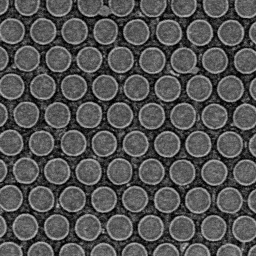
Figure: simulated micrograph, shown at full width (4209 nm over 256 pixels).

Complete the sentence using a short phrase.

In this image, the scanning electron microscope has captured a regular array of raised bodies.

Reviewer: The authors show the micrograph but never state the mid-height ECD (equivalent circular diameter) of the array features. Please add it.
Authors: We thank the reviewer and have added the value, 406 nm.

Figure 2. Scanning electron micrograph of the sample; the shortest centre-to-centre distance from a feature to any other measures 512 nm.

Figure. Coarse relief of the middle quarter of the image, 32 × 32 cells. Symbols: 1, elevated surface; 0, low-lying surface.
10001111100011111001111110011111
00000111000011110000111100001111
00000000000000000000000000000000
11110000011100000111000011110000
11111000111110001111100111110001
11111001111110011111100111111001
11111001111110011111100111111001
11111000111110011111100111111001
01110000011100000111000011110000
00000000000000000000000000000000
00001111000011110000111000001111
10001111100111110001111110011111
10011111100111111001111110011111
10011111100111111001111110011111
10001111100111110001111110011111
00000111000001110000111100001111
00000000000000000000000000000000
11110000111100001111000011100000
11111000111110011111000111110001
11111001111110011111100111111001
11111001111110011111100111111001
11111000111110011111100111110001
01110000111000001110000011100000
00000000000000000000000000000000
00001111000011110000111100001110
10001111100111111001111110011111
10011111100111111001111110011111
10011111100111111001111110011111
10011111100111111001111100011111
00000111000011110000111100001110
00000000000000000000000000000000
11110000111100001111000011100000